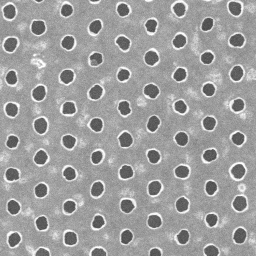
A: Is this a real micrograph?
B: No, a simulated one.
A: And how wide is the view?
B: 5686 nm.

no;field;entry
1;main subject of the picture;a regular array of holes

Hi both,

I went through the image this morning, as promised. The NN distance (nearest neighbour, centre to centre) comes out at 710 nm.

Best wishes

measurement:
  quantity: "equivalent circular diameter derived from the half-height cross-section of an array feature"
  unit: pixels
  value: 13.8